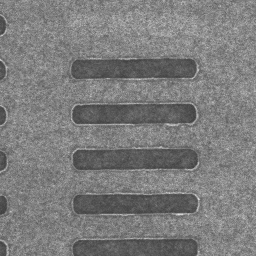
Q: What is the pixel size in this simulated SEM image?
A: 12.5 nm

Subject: holes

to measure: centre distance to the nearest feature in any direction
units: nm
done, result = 564